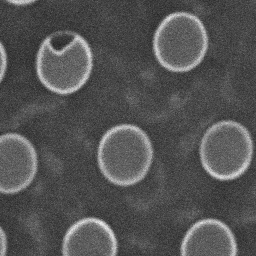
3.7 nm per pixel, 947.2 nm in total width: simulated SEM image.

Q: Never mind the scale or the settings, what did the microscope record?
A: raised bodies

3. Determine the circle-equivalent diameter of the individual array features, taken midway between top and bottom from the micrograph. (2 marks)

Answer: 203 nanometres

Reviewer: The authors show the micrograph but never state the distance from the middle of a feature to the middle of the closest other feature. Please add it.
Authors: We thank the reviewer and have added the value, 386 nanometers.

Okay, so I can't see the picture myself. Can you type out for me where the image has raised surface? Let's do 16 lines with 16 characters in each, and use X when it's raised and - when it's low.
----------------
----------XXX---
----------XXX---
--XXXX----XXX---
--XXXX----------
---XX-----------
----------------
----------------
X------XX----XXX
XX----XXX----XXX
XX----XXX----XX-
XX--------------
----------------
----------------
----XXX-----XX--
----XXX----XXXX-